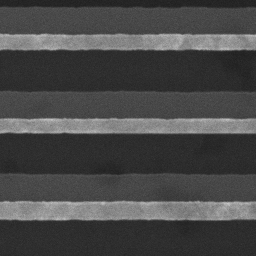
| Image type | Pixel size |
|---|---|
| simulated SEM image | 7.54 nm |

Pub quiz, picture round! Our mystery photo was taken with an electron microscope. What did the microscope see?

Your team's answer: lines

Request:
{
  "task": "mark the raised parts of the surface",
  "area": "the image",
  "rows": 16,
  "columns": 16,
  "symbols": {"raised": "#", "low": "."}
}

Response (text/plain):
################
################
################
................
................
................
################
################
................
................
................
################
################
################
................
................